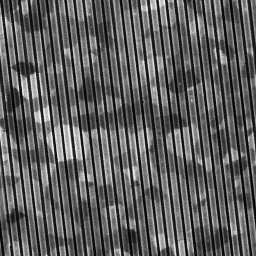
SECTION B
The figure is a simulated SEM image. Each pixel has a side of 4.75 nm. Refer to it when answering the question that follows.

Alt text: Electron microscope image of parallel lines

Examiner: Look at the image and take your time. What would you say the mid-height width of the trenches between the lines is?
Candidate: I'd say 2.97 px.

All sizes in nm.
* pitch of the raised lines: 43.2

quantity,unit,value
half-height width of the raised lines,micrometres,0.0277